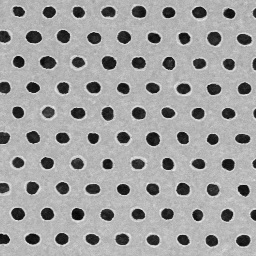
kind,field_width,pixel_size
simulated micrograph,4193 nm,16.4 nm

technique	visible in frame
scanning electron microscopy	a regular array of holes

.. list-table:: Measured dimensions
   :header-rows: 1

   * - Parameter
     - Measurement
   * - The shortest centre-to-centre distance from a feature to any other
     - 0.472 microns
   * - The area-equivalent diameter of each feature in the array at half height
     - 211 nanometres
